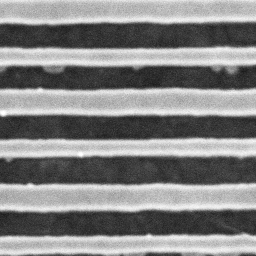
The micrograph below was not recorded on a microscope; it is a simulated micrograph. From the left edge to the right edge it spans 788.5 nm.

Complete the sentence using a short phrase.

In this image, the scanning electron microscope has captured lines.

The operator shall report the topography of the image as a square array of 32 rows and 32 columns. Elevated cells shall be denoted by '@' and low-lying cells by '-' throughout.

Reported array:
@@@@@@@@@@@@@@@@@@@@@@@@@@@@@@@@
@@@@@@@@@@@@@@@@@@@@@@@@@@@@@@@@
@@@@@@@@@@@@@@@@@@@@@@@@@@@@@@@@
--------------------------------
--------------------------------
--------------------------------
@@@@@@@@@@@@@@@@@@@@@@@@@@@@@@@@
@@@@@@@@@@@@@@@@@@@@@@@@@@@@@@@@
--------------------------------
--------------------------------
--------------------------------
@@@@@@@@@@@@@@@@@@@@@@@@@@@@@@@@
@@@@@@@@@@@@@@@@@@@@@@@@@@@@@@@@
@@@@@@@@@@@@@@@@@@@@@@@@@@@@@@@@
--------------------------------
--------------------------------
--------------------------------
-@@@@@@@@---------@@@@@@@@@@@@@@
@@@@@@@@@@@@@@@@@@@@@@@@@@@@@@@@
@@@@@@@@@@@-----------@@@@@--@@-
--------------------------------
--------------------------------
--------------------------------
@@@@@@@@@@@@@@@@@@@@@@@@@@@@@@@@
@@@@@@@@@@@@@@@@@@@@@@@@@@@@@@@@
@@@@@@@@@@@@@@@@@@@@@@@@@@@@@@@@
-----@--------------------------
--------------------------------
--------------------------------
------------------@--@@@@-@@@@@@
@@@@@@@@@@@@@@@@@@@@@@@@@@@@@@@@
@@@@@@@@@@@@@@@@@@@@@@@@@@@@@@@@